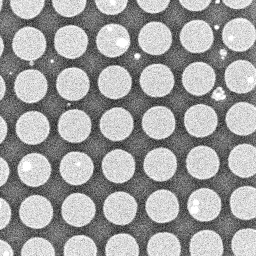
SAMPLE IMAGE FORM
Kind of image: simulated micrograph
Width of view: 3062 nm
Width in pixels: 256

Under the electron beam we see an array of small figures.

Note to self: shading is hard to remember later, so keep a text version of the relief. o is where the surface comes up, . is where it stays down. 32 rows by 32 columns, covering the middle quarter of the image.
.....................oooo......o
oooo......ooooo.....oooooo....oo
ooooo....ooooooo....ooooooo...oo
oooooo...oooooooo..oooooooo...oo
oooooo...oooooooo..oooooooo...oo
oooooo...oooooooo..oooooooo...oo
oooooo...ooooooo....ooooooo....o
ooooo.....oooooo.....ooooo......
oooo........o...................
................................
................................
............ooo......ooooo.....o
ooooo.....oooooo....ooooooo...oo
oooooo...oooooooo...ooooooo...oo
ooooooo..oooooooo...oooooooo..oo
ooooooo..oooooooo...oooooooo..oo
ooooooo..oooooooo...ooooooo....o
oooooo....oooooo.....oooooo.....
ooooo......oooo........oo.......
................................
................................
.............o........oooo......
.oooo......ooooo.....oooooo....o
oooooo....ooooooo...oooooooo...o
ooooooo...oooooooo..oooooooo...o
ooooooo...oooooooo..oooooooo...o
ooooooo...oooooooo..oooooooo...o
ooooooo...ooooooo....oooooo.....
oooooo.....ooooo......oooo......
.oooo........oo.................
................................
................................